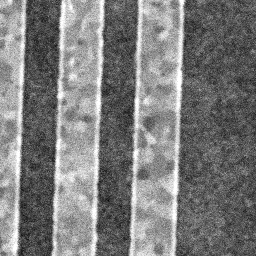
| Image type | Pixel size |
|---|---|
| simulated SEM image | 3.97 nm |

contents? one or a few lines or trenches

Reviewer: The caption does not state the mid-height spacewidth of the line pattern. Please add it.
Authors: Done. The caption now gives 0.153 µm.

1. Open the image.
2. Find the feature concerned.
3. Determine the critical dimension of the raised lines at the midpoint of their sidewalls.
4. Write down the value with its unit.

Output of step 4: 162 nm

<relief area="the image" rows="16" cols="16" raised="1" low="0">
1100110001100000
1000110001100000
1000110001100000
1000110001100000
1000110001100000
1000110001100000
1000110001100000
1000110001100000
1000110011100000
1000110011100000
1000110011100000
1000110011100000
1001110011100000
1001110011100000
1001110011100000
1001110011100000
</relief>